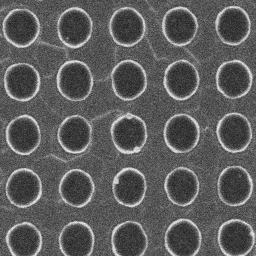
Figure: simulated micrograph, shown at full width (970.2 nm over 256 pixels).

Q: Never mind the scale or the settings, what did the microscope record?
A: a regular array of raised bodies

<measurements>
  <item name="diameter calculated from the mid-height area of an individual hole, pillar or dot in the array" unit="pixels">36.5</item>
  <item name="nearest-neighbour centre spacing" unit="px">52.6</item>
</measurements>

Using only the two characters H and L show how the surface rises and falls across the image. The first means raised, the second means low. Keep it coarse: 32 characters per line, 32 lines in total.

LLLLLLLLLLLLLLLLLLLLLLLLLLLLLLLL
LHHHLLLLHHHLLLLHHLLLLHHHLLLLHHHL
LHHHHLLHHHHLLLHHHHLLHHHHHLLHHHHL
HHHHHLLHHHHLLLHHHHLLHHHHHLLHHHHL
LHHHHLLHHHHLLLHHHHLLLHHHLLLHHHHL
LLHHLLLLHHLLLLLHHLLLLLHLLLLLHHLL
LLLLLLLLLLLLLLLLLLLLLLLLLLLLLLLL
LLLLLLLLLLLLLLLLLLLLLLLLLLLLLLLL
LHHHLLLLHHHLLLHHHHLLLHHHLLLLHHHL
LHHHHLLHHHHLLLHHHHLLLHHHHLLHHHHL
LHHHHLLHHHHLLLHHHHLLLHHHHLLHHHHL
LHHHHLLLHHHLLLHHHHLLLHHHLLLLHHHL
LLHLLLLLLHLLLLLLLLLLLLLLLLLLLLLL
LLLLLLLLLLLLLLLLLLLLLLLLLLLLLLLL
LLLLLLLLLHLLLLLLHLLLLLHHLLLLHHLL
LHHHHLLLHHHLLLHHHHLLLHHHHLLHHHHL
LHHHHLLHHHHLLLHHHHLLLHHHHLLHHHHL
LHHHHLLHHHHLLLHHHHLLLHHHHLLHHHHL
LHHHLLLLHHHLLLLHHHLLLHHHLLLLHHHL
LLLLLLLLLLLLLLLLLLLLLLLLLLLLLLLL
LLLLLLLLLLLLLLLLLLLLLLLLLLLLLLLL
LLHHLLLLLHLLLLLHHLLLLHHHLLLLHHHL
LHHHHLLLHHHLLLHHHHLLLHHHHLLHHHHL
LHHHHLLHHHHHLLHHHHLLLHHHHLLHHHHL
LHHHHLLLHHHLLLHHHHLLLHHHHLLHHHHL
LLHHLLLLLHHLLLLHHLLLLLHHLLLLHHLL
LLLLLLLLLLLLLLLLLLLLLLLLLLLLLLLL
LLLLLLLLLLLLLLLLLLLLLLHLLLLLLLLL
LLHHLLLLHHHLLLLHHHLLLHHHHLLLHHHL
LHHHHLLLHHHHLLHHHHLLLHHHHLLHHHHH
LHHHHLLLHHHHLLHHHHLLLHHHHLLHHHHH
LHHHHLLLHHHLLLHHHHLLLHHHHLLLHHHL